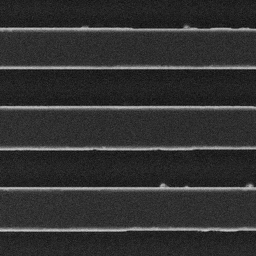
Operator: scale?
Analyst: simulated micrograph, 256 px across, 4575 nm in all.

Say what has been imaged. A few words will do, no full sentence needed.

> lines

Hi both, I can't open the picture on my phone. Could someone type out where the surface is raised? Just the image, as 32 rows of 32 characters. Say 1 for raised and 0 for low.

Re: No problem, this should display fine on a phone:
00000000000000000000000000000000
00000000000000000000000000000000
00000000000000000000000000000000
00000000000000000000000000000000
11111111111111111111111111111111
11111111111111111111111111111111
11111111111111111111111111111111
11111111111111111111111111111111
11111111111111111111111111111111
00000000000000000000000000000000
00000000000000000000000000000000
00000000000000000000000000000000
00000000000000000000000000000000
11111111111111111111111111111111
11111111111111111111111111111111
11111111111111111111111111111111
11111111111111111111111111111111
11111111111111111111111111111111
11111111111111111111111111111111
00000000000000000000000000000000
00000000000000000000000000000000
00000000000000000000000000000000
00000000000000000000000000000000
11111111111111111111111111111111
11111111111111111111111111111111
11111111111111111111111111111111
11111111111111111111111111111111
11111111111111111111111111111111
11111111111111111111111111111111
00000000000000000000000000000000
00000000000000000000000000000000
00000000000000000000000000000000